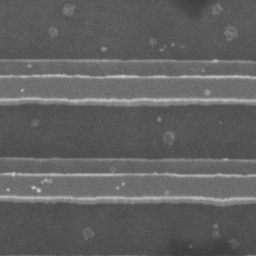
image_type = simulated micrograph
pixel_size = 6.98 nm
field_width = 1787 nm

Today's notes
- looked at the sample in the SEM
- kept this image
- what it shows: lines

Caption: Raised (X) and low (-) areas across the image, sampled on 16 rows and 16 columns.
----------------
----------------
----------------
----------------
XXXXXXXXXXXXXXXX
XXXXXXXXXXXXXXXX
----------------
----------------
----------------
----------------
XXXXXXXXXXXXXXXX
XXXXXXXXXXXXXXXX
-----X-------XXX
----------------
----------------
----------------